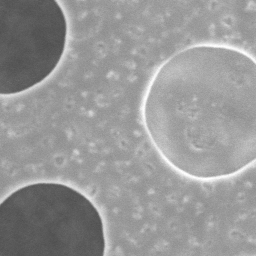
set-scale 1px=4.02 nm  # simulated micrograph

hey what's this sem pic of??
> holes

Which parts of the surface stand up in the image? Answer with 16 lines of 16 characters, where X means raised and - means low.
----XXXXXXXXXXXX
----XXXXXXXXXXXX
----XXXXXXXXXXXX
----XXXXXXXXXXXX
---XXXXXXXXXXXXX
--XXXXXXXXXXXXXX
XXXXXXXXXXXXXXXX
XXXXXXXXXXXXXXXX
XXXXXXXXXXXXXXXX
XXXXXXXXXXXXXXXX
XXXXXXXXXXXXXXXX
XX--XXXXXXXXXXXX
-----XXXXXXXXXXX
------XXXXXXXXXX
------XXXXXXXXXX
-------XXXXXXXXX